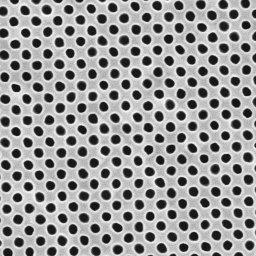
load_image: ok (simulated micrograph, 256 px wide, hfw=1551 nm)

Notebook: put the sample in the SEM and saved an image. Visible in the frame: a regular array of holes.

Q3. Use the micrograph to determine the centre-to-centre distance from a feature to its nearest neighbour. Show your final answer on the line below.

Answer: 15.1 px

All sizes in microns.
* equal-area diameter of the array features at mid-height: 0.056